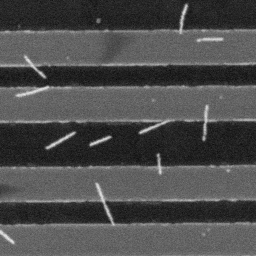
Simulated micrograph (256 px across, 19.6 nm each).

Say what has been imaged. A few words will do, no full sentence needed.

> lines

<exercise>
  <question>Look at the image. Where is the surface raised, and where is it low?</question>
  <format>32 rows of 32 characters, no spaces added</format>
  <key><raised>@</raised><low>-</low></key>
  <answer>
--------------------------------
--------------------------------
--------------------------------
--------------------------------
@@@@@@@@@@@@@@@@@@@@@@@@@@@@@@@@
@@@@@@@@@@@@@@@@@@@@@@@@@@@@@@@@
@@@@@@@@@@@@@@@@@@@@@@@@@@@@@@@@
@@@@@@@@@@@@@@@@@@@@@@@@@@@@@@@@
--------------------------------
--------------------------------
--------------------------------
@@@@@@@@@@@@@@@@@@@@@@@@@@@@@@@@
@@@@@@@@@@@@@@@@@@@@@@@@@@@@@@@@
@@@@@@@@@@@@@@@@@@@@@@@@@@@@@@@@
@@@@@@@@@@@@@@@@@@@@@@@@@@@@@@@@
--------------------------------
--------------------------------
--------------------------------
--------------------------------
--------------------------------
--------------------------------
@@@@@@@@@@@@@@@@@@@@@@@@@@@@@@@@
@@@@@@@@@@@@@@@@@@@@@@@@@@@@@@@@
@@@@@@@@@@@@@@@@@@@@@@@@@@@@@@@@
@@@@@@@@@@@@@@@@@@@@@@@@@@@@@@@@
--------------------------------
--------------------------------
--------------------------------
@@@@@@@@@@@@@@@@@@@@@@@@@@@@@@@@
@@@@@@@@@@@@@@@@@@@@@@@@@@@@@@@@
@@@@@@@@@@@@@@@@@@@@@@@@@@@@@@@@
@@@@@@@@@@@@@@@@@@@@@@@@@@@@@@@@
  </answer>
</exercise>